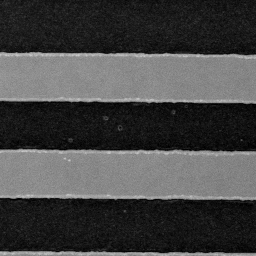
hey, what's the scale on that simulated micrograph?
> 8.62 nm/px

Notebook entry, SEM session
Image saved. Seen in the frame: lines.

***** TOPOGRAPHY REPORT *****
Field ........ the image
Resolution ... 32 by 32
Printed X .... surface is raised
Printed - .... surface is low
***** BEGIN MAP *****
--------------------------------
--------------------------------
--------------------------------
--------------------------------
--------------------------------
--------------------------------
--------------------------------
XXXXXXXXXXXXXXXXXXXXXXXXXXXXXXXX
XXXXXXXXXXXXXXXXXXXXXXXXXXXXXXXX
XXXXXXXXXXXXXXXXXXXXXXXXXXXXXXXX
XXXXXXXXXXXXXXXXXXXXXXXXXXXXXXXX
XXXXXXXXXXXXXXXXXXXXXXXXXXXXXXXX
XXXXXXXXXXXXXXXXXXXXXXXXXXXXXXXX
--------------------------------
--------------------------------
--------------------------------
--------------------------------
--------------------------------
--------------------------------
XXXXXXXXXXXXXXXXXXXXXXXXXXXXXXXX
XXXXXXXXXXXXXXXXXXXXXXXXXXXXXXXX
XXXXXXXXXXXXXXXXXXXXXXXXXXXXXXXX
XXXXXXXXXXXXXXXXXXXXXXXXXXXXXXXX
XXXXXXXXXXXXXXXXXXXXXXXXXXXXXXXX
XXXXXXXXXXXXXXXXXXXXXXXXXXXXXXXX
--------------------------------
--------------------------------
--------------------------------
--------------------------------
--------------------------------
--------------------------------
XXXXXXXXXX-X--------------------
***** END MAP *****